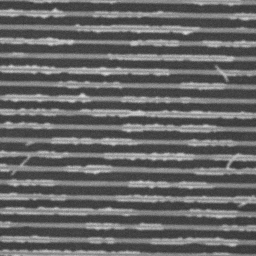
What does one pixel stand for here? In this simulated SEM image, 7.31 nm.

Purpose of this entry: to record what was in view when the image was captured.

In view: parallel lines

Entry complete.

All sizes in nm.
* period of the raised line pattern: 103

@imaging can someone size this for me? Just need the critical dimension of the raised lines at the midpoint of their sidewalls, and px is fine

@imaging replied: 4.87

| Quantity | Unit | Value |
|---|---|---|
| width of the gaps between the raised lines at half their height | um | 0.0639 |